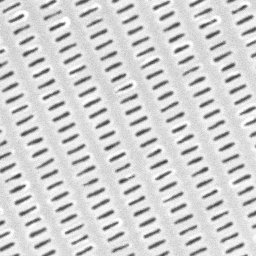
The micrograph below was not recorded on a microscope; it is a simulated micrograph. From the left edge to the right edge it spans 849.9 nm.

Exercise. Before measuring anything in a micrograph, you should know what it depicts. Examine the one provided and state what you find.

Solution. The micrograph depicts a regular array of holes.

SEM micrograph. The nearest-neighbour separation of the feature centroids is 39.4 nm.